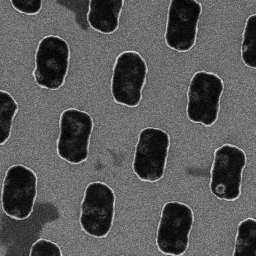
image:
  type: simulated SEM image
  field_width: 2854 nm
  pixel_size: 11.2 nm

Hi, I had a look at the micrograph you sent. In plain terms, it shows a regular array of raised bodies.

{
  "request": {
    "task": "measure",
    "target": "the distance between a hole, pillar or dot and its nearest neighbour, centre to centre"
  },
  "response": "861 nanometers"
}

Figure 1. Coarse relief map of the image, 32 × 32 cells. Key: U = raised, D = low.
DUUUUDDDDDDUUUUDDDDDDUUUUDDDDDDD
DDDUUDDDDDDUUUUDDDDDDUUUUDDDDDDD
DDDDDDDDDDDUUUUDDDDDDUUUUDDDDDDU
DDDDDDDDDDDDUUUDDDDDDUUUUDDDDDDU
DDDDDDUDDDDDDDDDDDDDDUUUUDDDDDUU
DDDDDUUUDDDDDDDDDDDDDUUUDDDDDDUU
DDDDDUUUUDDDDDDDUDDDDDDDDDDDDDUU
DDDDUUUUUDDDDDUUUUDDDDDDDDDDDDUU
DDDDUUUUDDDDDDUUUUDDDDDDDDDDDDDD
DDDDUUUUDDDDDDUUUUDDDDDDUUUDDDDD
DDDDDUUUDDDDDDUUUUDDDDDDUUUUDDDD
UDDDDDDDDDDDDDUUUUDDDDDUUUUUDDDD
UUDDDDDDDDDDDDUUUUDDDDDUUUUUDDDD
UUDDDDDDDDDDDDDDDDDDDDDUUUUDDDDD
UUDDDDDDUUUDDDDDDDDDDDDUUUUDDDDD
UDDDDDDUUUUUDDDDDDDDDDDDDUUDDDDD
UDDDDDDUUUUDDDDDDDUUUDDDDDDDDDDD
UDDDDDDUUUUDDDDDDUUUUDDDDDDDDDDD
DDDDDDDUUUUDDDDDDUUUUDDDDDDUUUDD
DDDDDDDUUUUDDDDDDUUUUDDDDDDUUUUD
DDDDDDDDDDDDDDDDDUUUUDDDDDDUUUUD
DUUUDDDDDDDDDDDDDUUUDDDDDDUUUUDD
DUUUUDDDDDDDDDDDDDUUDDDDDDUUUUDD
UUUUUDDDDDDUUUDDDDDDDDDDDDUUUUDD
UUUUUDDDDDUUUUDDDDDDDDDDDDDUUUDD
UUUUDDDDDDUUUUDDDDDDDUUDDDDDDDDD
DUUUDDDDDDUUUUDDDDDDUUUUDDDDDDDD
DDDDDDDDDDUUUUDDDDDDUUUUDDDDDDDU
DDDDDDDDDDUUUUDDDDDDUUUUDDDDDDUU
DDDDDDDDDDDDUDDDDDDDUUUUDDDDDDUU
DDDDUUUDDDDDDDDDDDDDUUUDDDDDDUUU
DDDDUUUUDDDDDDDDDDDDUUUDDDDDDUUU